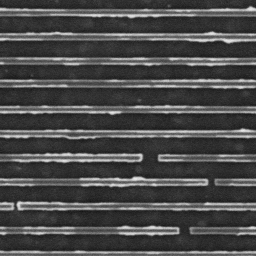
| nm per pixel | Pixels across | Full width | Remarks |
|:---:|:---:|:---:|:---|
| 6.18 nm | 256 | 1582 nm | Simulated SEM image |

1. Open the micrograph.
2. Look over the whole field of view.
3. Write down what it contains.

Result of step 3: parallel lines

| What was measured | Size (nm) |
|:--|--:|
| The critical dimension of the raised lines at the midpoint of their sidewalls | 42.5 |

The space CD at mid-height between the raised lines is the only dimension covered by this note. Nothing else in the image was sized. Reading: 107 nanometres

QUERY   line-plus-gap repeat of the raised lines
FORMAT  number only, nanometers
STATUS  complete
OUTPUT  150